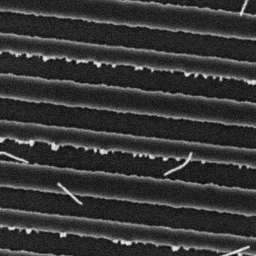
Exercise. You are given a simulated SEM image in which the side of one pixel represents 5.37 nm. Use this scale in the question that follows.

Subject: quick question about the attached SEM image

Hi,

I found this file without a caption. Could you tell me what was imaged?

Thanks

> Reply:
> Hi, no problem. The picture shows lines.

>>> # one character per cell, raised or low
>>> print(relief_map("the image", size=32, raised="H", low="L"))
HHHHHHHHHHHHHHHHHHHHLLLLLLLLLLLL
LLHHHHHHHHHHHHHHHHHHHHHHHHHHHLHL
LLLLLLLLLLLHHHHHHHHHHHHHHHHHHHHH
LLLLLLLLLLLLLLLLLLLHHHHHHHHHHHHH
HHHLLLLLLLLLLLLLLLLLLLLLLLLLHHHH
HHHHHHHHHHHHLLLLLLLLLLLLLLLLLLLL
HHHHHHHHHHHHHHHHHHHHLLLLLLLLLLLL
LLLLLLLLLHHHHHHHHHHHHHHHHHHHHLLL
LLLLLLLLLLLLLLLLLLLHHHHHHHHHHHHH
HHLLLLLLLLLLLLLLLLLLLLLLLLLHHHHH
HHHHHHHHHHLLLLLLLLLLLLLLLLLLLLLL
HHHHHHHHHHHHHHHHHHHHLLLLLLLLLLLL
LLHHHHHHHHHHHHHHHHHHHHHHHHHHHLLL
LLLLLLLLLLLHHHHHHHHHHHHHHHHHHHHH
LLLLLLLLLLLLLLLLLLLLHHHHHHHHHHHH
HHHHHLLLLLLLLLLLLLLLLLLLLLLLHHHH
HHHHHHHHHHHHLLLLLLLLLLLLLLLLLLLL
LLHHHHHHHHHHHHHHHHHHHHLLLLLLLLLL
LLLLLLLLLLLHHHHHHHHHHHHHHHHHHHLL
LLLLLLLLLLLLLLLLLLLHHHHHHHHHHHHH
HHHHHLLLLLLLLLLLLLLLLLLLLLLLLHHH
HHHHHHHHHHHHHLLLLLLLLLLLLLLLLLLL
HHHHHHHHHHHHHHHHHHHHHLLLLLLLLLLL
LHHHHHHHHHHHHHHHHHHHHHHHHHHHHHLL
LLLLLLLLLLLHHHHHHHHHHHHHHHHHHHHH
LLLLLLLLLLLLLLLLLLLHHHHHHHHHHHHH
HHHLLLLLLLLLLLLLLLLLLLLLLLLHHHHH
HHHHHHHHHHHHHLLLLLLLLLLLLLLLLLLL
LHHHHHHHHHHHHHHHHHHHHLLLLLLLLLLL
LLLLLLLLLLLHHHHHHHHHHHHHHHHHHLLL
LLLLLLLLLLLLLLLLLLLHHHHHHHHHHHHH
HHHHLLLLLLLLLLLLLLLLLLLLLLLLHHHH